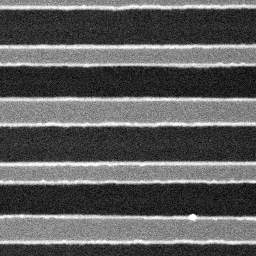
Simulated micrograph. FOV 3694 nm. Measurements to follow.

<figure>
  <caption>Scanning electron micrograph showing lines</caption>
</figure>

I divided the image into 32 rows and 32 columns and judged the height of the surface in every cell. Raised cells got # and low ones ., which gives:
################################
................................
................................
................................
................................
................................
################################
################################
................................
................................
................................
................................
.......###.....#..####.##....#..
################################
################################
##############################.#
................................
................................
................................
................................
......................#....##.##
################################
################################
................................
................................
................................
................................
################################
################################
################################
................................
................................